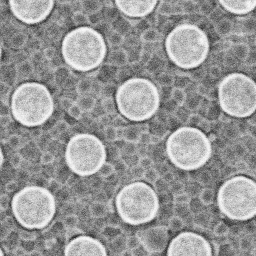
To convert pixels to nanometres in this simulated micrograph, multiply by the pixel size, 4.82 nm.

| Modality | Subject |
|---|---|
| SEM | a regular array of raised bodies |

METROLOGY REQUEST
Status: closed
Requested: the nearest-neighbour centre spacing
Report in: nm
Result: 347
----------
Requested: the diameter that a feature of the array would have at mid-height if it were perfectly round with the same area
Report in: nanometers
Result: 198